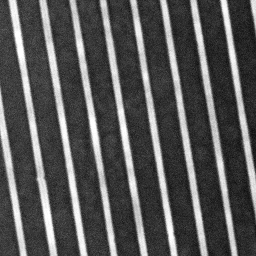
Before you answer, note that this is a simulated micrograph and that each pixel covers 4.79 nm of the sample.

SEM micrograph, parallel lines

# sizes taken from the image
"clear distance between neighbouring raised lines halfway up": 24.1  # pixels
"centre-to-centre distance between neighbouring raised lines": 143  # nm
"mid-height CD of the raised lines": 5.3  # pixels